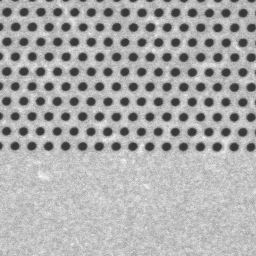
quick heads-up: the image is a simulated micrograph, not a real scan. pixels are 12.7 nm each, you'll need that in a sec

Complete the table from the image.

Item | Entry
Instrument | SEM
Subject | a regular array of holes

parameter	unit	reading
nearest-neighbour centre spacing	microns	0.211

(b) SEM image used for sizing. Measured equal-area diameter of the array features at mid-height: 114 nanometres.